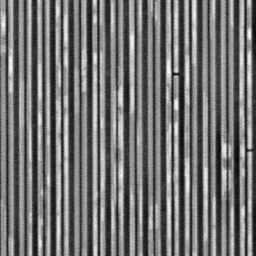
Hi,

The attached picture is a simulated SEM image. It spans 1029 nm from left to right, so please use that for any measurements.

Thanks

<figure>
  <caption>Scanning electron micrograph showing parallel lines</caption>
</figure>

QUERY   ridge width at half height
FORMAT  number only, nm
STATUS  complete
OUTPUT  19.1